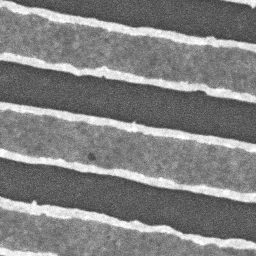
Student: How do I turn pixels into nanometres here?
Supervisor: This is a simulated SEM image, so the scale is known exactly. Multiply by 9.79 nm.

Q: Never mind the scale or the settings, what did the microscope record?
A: one or a few lines or trenches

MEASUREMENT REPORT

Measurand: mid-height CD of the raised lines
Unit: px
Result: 50.3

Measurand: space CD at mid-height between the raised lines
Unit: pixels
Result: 46.7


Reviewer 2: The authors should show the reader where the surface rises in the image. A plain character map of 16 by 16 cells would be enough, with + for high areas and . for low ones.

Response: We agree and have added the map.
+...............
++++++..........
++++++++++++....
++++++++++++++++
.....+++++++++++
.............+++
................
++++++..........
++++++++++++....
++++++++++++++++
.....+++++++++++
..........++++++
................
++++++..........
+++++++++++.....
++++++++++++++++